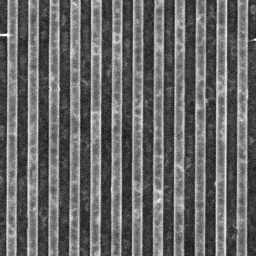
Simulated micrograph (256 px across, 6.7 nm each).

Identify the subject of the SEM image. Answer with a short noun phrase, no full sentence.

parallel lines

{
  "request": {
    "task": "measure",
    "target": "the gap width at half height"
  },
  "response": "0.077 microns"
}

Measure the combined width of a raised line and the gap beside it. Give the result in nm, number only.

140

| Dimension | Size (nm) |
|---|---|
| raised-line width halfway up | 65.3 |